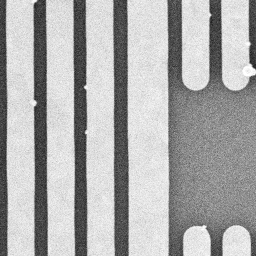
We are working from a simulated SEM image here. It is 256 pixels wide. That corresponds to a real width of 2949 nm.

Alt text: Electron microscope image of groups of lines, slits or small figures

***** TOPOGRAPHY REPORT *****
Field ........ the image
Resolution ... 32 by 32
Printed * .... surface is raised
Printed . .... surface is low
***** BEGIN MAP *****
.***..***..***..*****..***..***.
.***..***..***..*****..***..***.
.***..***..***..*****..***..***.
.***..***..***..*****..***..***.
.***..***..***..*****..***..***.
.***..***..***..*****..***..***.
.***..***..***..*****..***..***.
.***..***..***..*****..***..***.
.***..***..***..*****..***..****
.***..***..***..*****..***..***.
.***..***..***..*****..***..***.
.***..***..***..*****...........
.***..***..***..*****...........
.***..***..***..*****...........
.***..***..***..*****...........
.***..***..***..*****...........
.***..***..***..*****...........
.***..***..***..*****...........
.***..***..***..*****...........
.***..***..***..*****...........
.***..***..***..*****...........
.***..***..***..*****...........
.***..***..***..*****...........
.***..***..***..*****...........
.***..***..***..*****...........
.***..***..***..*****...........
.***..***..***..*****...........
.***..***..***..*****...........
.***..***..***..*****...**...*..
.***..***..***..*****..***..***.
.***..***..***..*****..***..***.
.***..***..***..*****..***..***.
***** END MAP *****